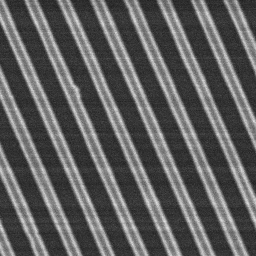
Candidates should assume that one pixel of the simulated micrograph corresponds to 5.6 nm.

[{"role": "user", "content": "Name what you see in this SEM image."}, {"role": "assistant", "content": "parallel lines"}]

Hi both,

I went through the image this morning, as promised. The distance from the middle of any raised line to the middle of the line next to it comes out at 0.171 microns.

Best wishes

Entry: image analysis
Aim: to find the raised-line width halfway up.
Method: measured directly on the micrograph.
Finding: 57.2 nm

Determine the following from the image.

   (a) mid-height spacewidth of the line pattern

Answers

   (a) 114 nanometres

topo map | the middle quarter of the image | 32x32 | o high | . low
......oo......ooo.....ooo......o
o.....ooo......oo......ooo.....o
o......oo......ooo.....ooo......
o......ooo.....ooo......oo......
oo......oo......ooo.....ooo.....
ooo.....oo......ooo......oo.....
ooo.....ooo......oo......ooo....
.ooo.....oo......ooo.....ooo....
.ooo.....ooo......oo......ooo...
.ooo......oo......ooo.....ooo...
..ooo.....ooo.....ooo......oo...
..ooo......oo......ooo.....ooo..
...ooo.....ooo.....ooo......oo..
...ooo.....ooo......oo......ooo.
....oo......ooo.....ooo......oo.
....ooo.....ooo......oo......ooo
....ooo......oo......ooo.....ooo
.....ooo.....ooo......oo......oo
.....ooo......oo......ooo.....oo
......oo......ooo.....ooo......o
o.....ooo.....ooo......ooo.....o
o......oo......ooo.....ooo......
o......ooo.....ooo......oo......
oo.....ooo......oo......ooo.....
oo......ooo.....ooo......oo.....
ooo.....ooo......oo......ooo....
ooo......oo......ooo.....ooo....
.ooo.....ooo......oo......ooo...
.ooo......oo......ooo.....ooo...
..oo......ooo......oo......oo...
..ooo......oo......ooo.....ooo..
...oo......ooo......oo......oo..